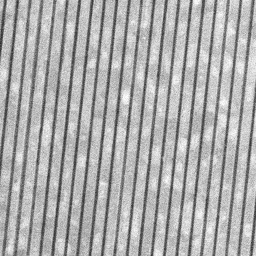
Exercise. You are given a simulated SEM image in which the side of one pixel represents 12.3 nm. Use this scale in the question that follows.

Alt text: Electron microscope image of parallel lines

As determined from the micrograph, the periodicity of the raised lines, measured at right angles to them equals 152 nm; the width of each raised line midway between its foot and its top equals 108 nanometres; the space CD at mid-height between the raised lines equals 0.0473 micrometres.